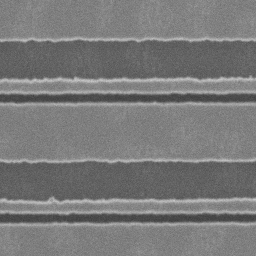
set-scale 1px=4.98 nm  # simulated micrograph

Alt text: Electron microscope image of lines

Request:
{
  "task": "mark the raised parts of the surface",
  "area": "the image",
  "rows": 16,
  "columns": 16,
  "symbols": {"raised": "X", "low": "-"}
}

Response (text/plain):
XXXXXXXXXXXXXXXX
XXXXXXXXXXXXXXXX
XXXX-XXXX-XXXXXX
----------------
----------------
XXXXXXXXXXXXXXXX
XXXXXXXXXXXXXXXX
XXXXXXXXXXXXXXXX
XXXXXXXXXXXXXXXX
XXXXXXXXXXXXXXXX
----------------
----------------
--------------XX
---X----X--XXXXX
XXXXXXXXXXXXXXXX
XXXXXXXXXXXXXXXX